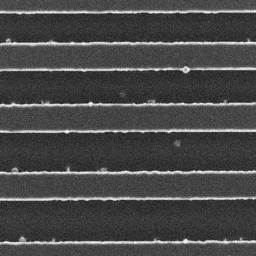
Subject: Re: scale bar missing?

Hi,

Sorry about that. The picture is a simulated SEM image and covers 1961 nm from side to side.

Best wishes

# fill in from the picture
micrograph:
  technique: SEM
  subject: lines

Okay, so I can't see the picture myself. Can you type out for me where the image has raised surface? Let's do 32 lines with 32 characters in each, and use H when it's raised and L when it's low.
HHHHHHHHHHHHHHHHHHHHHHHHHHHHHHHH
HHHHHHHHHHHHHHHHHLHHHHHHLHHLLLLL
LLLLLLLLLLLLLLLLLLLLLLLLLLLLLLLL
LLLLLLLLLLLLLLLLLLLLLLLLLLLLLLLL
LLLLLLLLLLLLLLLLLLLLLLLLLLLLLLLL
HHHHHHHHHHHHHHHHHHHHHHHHHHHHHHHH
HHHHHHHHHHHHHHHHHHHHHHHHHHHHHHHH
HHHHHHHHHHHHHHHHHHHHHHHHHHHHHHHH
HHHHHHHHHHHHHHHHHHHHHHHHHHHHHHHH
LLLLLLLLLLLLLLLLLLLLLLLLLLLLLLLL
LLLLLLLLLLLLLLLLLLLLLLLLLLLLLLLL
LLLLLLLLLLLLLLLLLLLLLLLLLLLLLLLL
LLLLLLLLLLLLLLLLLLLLLLLLLLLLLLLL
HHHHHHHHHHHHHHHHHHHHHHHHHHHHHHHH
HHHHHHHHHHHHHHHHHHHHHHHHHHHHHHHH
HHHHHHHHHHHHHHHHHHHHHHHHHHHHHHHH
HHHHHHHHHHHHHLHHLLLLLHLLLLLLLLLL
LLLLLLLLLLLLLLLLLLLLLLLLLLLLLLLL
LLLLLLLLLLLLLLLLLLLLLLLLLLLLLLLL
LLLLLLLLLLLLLLLLLLLLLLLLLLLLLLLL
LLLLLLLLLLLLLLLLLLLLLLLLLLLLLLLL
LLLLLLLLLLLLLLLHLHHHLHHLHHHHHHHH
HHHHHHHHHHHHHHHHHHHHHHHHHHHHHHHH
HHHHHHHHHHHHHHHHHHHHHHHHHHHHHHHH
HHHHHHHHHHHHHHHHHHHHHHHHHHHHHHHH
LLLLLLLLLLLLLLLLLLLLLLLLLLLLLLLL
LLLLLLLLLLLLLLLLLLLLLLLLLLLLLLLL
LLLLLLLLLLLLLLLLLLLLLLLLLLLLLLLL
LLLLLLLLLLLLLLLLLLLLLLLLLLLLLLLL
LLLLLLLLLLLLLLLLLLLLLLLLLLLLLLLL
HHHHHHHHHHHHHHHHHHHHHHHHHHHHHHHH
HHHHHHHHHHHHHHHHHHHHHHHHHHHHHHHH